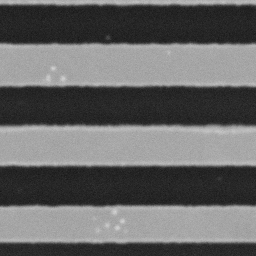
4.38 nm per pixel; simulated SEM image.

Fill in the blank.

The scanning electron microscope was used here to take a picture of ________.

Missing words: lines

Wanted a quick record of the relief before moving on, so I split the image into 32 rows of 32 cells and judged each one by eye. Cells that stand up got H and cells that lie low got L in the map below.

LLLLLLLHHHLLHLHHLLLHHLHHHHHLLHLL
LLLLLLLLLLLLLLLLLLLLLLLLLLLLLLLL
LLLLLLLLLLLLLLLLLLLLLLLLLLLLLLLL
LLLLLLLLLLLLLLLLLLLLLLLLLLLLLLLL
LLLLLLLLLLLLLLLLLLLLLLLLLLLLLLLL
LLLLLLLLLLLLLLLLLLLLLLLLLLLLLLLL
HHHHHHHHHHHHHHHHHHHHHHHHHHHHHHHH
HHHHHHHHHHHHHHHHHHHHHHHHHHHHHHHH
HHHHHHHHHHHHHHHHHHHHHHHHHHHHHHHH
HHHHHHHHHHHHHHHHHHHHHHHHHHHHHHHH
HHHHHHHHHHHHHHHHHHHHHHHHHHHHHHHH
LLLLLLLLLLLLLLLLLLLLLLLLLLLLLLLL
LLLLLLLLLLLLLLLLLLLLLLLLLLLLLLLL
LLLLLLLLLLLLLLLLLLLLLLLLLLLLLLLL
LLLLLLLLLLLLLLLLLLLLLLLLLLLLLLLL
LLLLLLLLLLLLLLLLLLLLLLLLLLLLLLLL
HHHHHHHHHHHHHHHHHHHHHHHHHHHHHHHH
HHHHHHHHHHHHHHHHHHHHHHHHHHHHHHHH
HHHHHHHHHHHHHHHHHHHHHHHHHHHHHHHH
HHHHHHHHHHHHHHHHHHHHHHHHHHHHHHHH
HHHHHHHHHHHHHHHHHHHHHHHHHHHHHHHH
LLLLLLLLLLLLLLLLLLLLLLLLLLLLLLLL
LLLLLLLLLLLLLLLLLLLLLLLLLLLLLLLL
LLLLLLLLLLLLLLLLLLLLLLLLLLLLLLLL
LLLLLLLLLLLLLLLLLLLLLLLLLLLLLLLL
LLLLLLLLLLLLLLLLLLLLLLLLLLLLLLLL
HHHHHHHHHHHHHHHHHHHHHHHHHHHHHHHH
HHHHHHHHHHHHHHHHHHHHHHHHHHHHHHHH
HHHHHHHHHHHHHHHHHHHHHHHHHHHHHHHH
HHHHHHHHHHHHHHHHHHHHHHHHHHHHHHHH
LLLLLLLLLLLLLLLLLLLLLLLLLLLLLLLL
LLLLLLLLLLLLLLLLLLLLLLLLLLLLLLLL